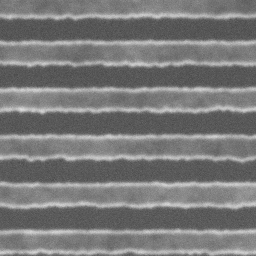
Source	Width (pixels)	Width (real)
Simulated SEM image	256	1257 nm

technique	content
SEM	lines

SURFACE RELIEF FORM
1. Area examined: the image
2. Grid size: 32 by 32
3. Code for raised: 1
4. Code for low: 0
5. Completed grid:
11111111111111111111111111111111
11111111111111111111111111111111
00000000000000000000000000000000
00000000000000000000000000000000
00000000000000000000000000000000
11111111111111111111111111111111
11111111111111111111111111111111
11111111111111111111111111111111
00000000000000000000000000000000
00000000000000000000000000000000
00000000000000000000000000000000
11111111111111111111111111111111
11111111111111111111111111111111
11111111111111111111111111111111
00000000000000000000000000000000
00000000000000000000000000000000
00000000000000000000000000000000
11111111111111111111111111111111
11111111111111111111111111111111
11111111111111111111111111111111
00000000000000000000000000000000
00000000000000000000000000000000
00000000000000000000000000000000
11111111111111111111111111111111
11111111111111111111111111111111
11111111111111111111111111111111
00000000000000000000000000000000
00000000000000000000000000000000
00000000000000000000000000000000
11111111111111111111111111111111
11111111111111111111111111111111
11111111111111110111111111111111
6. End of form